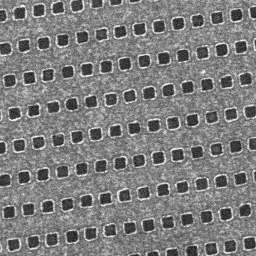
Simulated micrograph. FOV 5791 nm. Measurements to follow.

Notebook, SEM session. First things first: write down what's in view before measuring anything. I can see a regular array of holes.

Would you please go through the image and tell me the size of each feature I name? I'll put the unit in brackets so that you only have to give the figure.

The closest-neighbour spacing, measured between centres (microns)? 0.438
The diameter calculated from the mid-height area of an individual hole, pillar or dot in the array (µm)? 0.292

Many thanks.